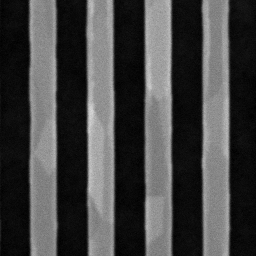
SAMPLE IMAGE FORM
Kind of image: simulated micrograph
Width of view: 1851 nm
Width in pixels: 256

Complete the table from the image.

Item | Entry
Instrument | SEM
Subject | wiring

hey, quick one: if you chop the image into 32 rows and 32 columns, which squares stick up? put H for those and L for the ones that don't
LLLLHHHLLLLHHHLLLLHHHLLLLHHHHLLL
LLLLHHHLLLLHHHLLLLHHHLLLLHHHHLLL
LLLLHHHLLLLHHHLLLLHHHLLLLHHHLLLL
LLLLHHHLLLLHHHLLLLHHHLLLLHHHLLLL
LLLLHHHLLLLHHHLLLLHHHLLLLHHHHLLL
LLLLHHHLLLLHHHLLLLHHHLLLLHHHHLLL
LLLLHHHLLLLHHHLLLLHHHLLLLHHHHLLL
LLLLHHHLLLLHHHLLLLHHHLLLLHHHHLLL
LLLLHHHLLLLHHHLLLLHHHLLLLHHHHLLL
LLLLHHHLLLLHHHLLLLHHHLLLLHHHHLLL
LLLLHHHLLLLHHHLLLLHHHLLLLHHHHLLL
LLLLHHHLLLLHHHLLLLHHHLLLLHHHHLLL
LLLLHHHLLLLHHHLLLLHHHLLLLHHHHLLL
LLLLHHHLLLLHHHLLLLHHHLLLLHHHHLLL
LLLLHHHLLLLHHHLLLLHHHLLLLHHHHLLL
LLLLHHHLLLLHHHLLLLHHHLLLLHHHHLLL
LLLLHHHLLLLHHHLLLLHHHLLLLHHHHLLL
LLLLHHHLLLLHHHLLLLHHHLLLLHHHHLLL
LLLLHHHLLLLHHHLLLLHHHLLLLHHHHLLL
LLLLHHHLLLLHHHLLLLHHHLLLLHHHHLLL
LLLLHHHLLLLHHHLLLLHHHLLLLHHHHLLL
LLLLHHHLLLLHHHLLLLHHHLLLLHHHHLLL
LLLLHHHLLLLHHHLLLLHHHLLLLHHHHLLL
LLLLHHHLLLLHHHLLLLHHHLLLLHHHHLLL
LLLLHHHLLLLHHHLLLLHHHLLLLHHHHLLL
LLLLHHHLLLLHHHLLLLHHHLLLLHHHHLLL
LLLLHHHLLLLHHHLLLLHHHLLLLHHHHLLL
LLLLHHHLLLLHHHLLLLHHHLLLLHHHHLLL
LLLLHHHLLLLHHHLLLLHHHLLLLHHHHLLL
LLLLHHHLLLLHHHLLLLHHHLLLLHHHHLLL
LLLLHHHLLLLHHHLLLLHHHLLLLHHHHLLL
LLLLHHHLLLLHHHLLLLHHHLLLLHHHHLLL